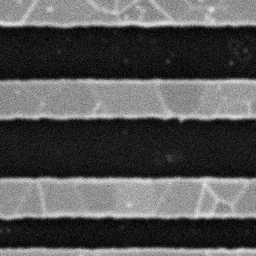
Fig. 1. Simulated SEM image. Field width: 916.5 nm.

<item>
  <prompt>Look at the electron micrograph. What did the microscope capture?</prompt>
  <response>lines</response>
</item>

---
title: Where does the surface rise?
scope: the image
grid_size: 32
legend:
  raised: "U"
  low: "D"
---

UUUUUUUUUUUUUUUUUUUUUUUUUUUUUUUU
UUUUUUUUUUUUUUUUUUUUUUUUUUUUUUUU
UUUUUUUUUUUUUUUUUUUUUUUUUUUUUUUU
DDDDDDDDDDDDDDDDDDDDDDDDDDDDDDDD
DDDDDDDDDDDDDDDDDDDDDDDDDDDDDDDD
DDDDDDDDDDDDDDDDDDDDDDDDDDDDDDDD
DDDDDDDDDDDDDDDDDDDDDDDDDDDDDDDD
DDDDDDDDDDDDDDDDDDDDDDDDDDDDDDDD
DDDDDDDDDDDDDDDDDDDDDDDDDDDDDDDD
DDDDDDDDDDDDDDDDDDDDDDDDDDDDDDDD
UUUUUUUUUUUUUUUUUUUUUUUUUUUUUUUU
UUUUUUUUUUUUUUUUUUUUUUUUUUUUUUUU
UUUUUUUUUUUUUUUUUUUUUUUUUUUUUUUU
UUUUUUUUUUUUUUUUUUUUUUUUUUUUUUUU
UUUUUUUUUUUUUUUUUUUUUUUUUUUUUUUU
DDDDDDDDDDDDDDDDDDDDDDDDDDDDDDDD
DDDDDDDDDDDDDDDDDDDDDDDDDDDDDDDD
DDDDDDDDDDDDDDDDDDDDDDDDDDDDDDDD
DDDDDDDDDDDDDDDDDDDDDDDDDDDDDDDD
DDDDDDDDDDDDDDDDDDDDDDDDDDDDDDDD
DDDDDDDDDDDDDDDDDDDDDDDDDDDDDDDD
DDDDDDDDDDDDDDDDDDDDDDDDDDDDDDDD
UUUUUUUUUUUUUUUUUUUUUUUUUUUUUUUU
UUUUUUUUUUUUUUUUUUUUUUUUUUUUUUUU
UUUUUUUUUUUUUUUUUUUUUUUUUUUUUUUU
UUUUUUUUUUUUUUUUUUUUUUUUUUUUUUUU
UUUUUUUUUUUUUUUUUUUUUUUUUUUUUUUU
DDDDDDDDDDDDDDDDDDDDDDDDDDDDDDDD
DDDDDDDDDDDDDDDDDDDDDDDDDDDDDDDD
DDDDDDDDDDDDDDDDDDDDDDDDDDDDDDDD
DDDDDDDDDDDDDDDDDDDDDDDDDDDDDDDD
UUUUUUUUUUUUUUUUUUUUUUUUUUUUUUUU